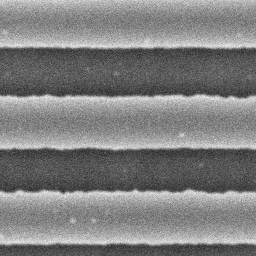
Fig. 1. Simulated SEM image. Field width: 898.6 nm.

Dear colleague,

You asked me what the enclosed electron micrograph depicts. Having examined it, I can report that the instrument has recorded lines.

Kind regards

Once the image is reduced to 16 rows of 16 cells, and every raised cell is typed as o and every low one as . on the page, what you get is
oooooooooooooooo
oooooooooooooooo
oooooooooooooooo
................
................
................
oooooooooooooooo
oooooooooooooooo
oooooooooooooooo
................
................
................
oooooooooooooooo
oooooooooooooooo
oooooooooooooooo
................